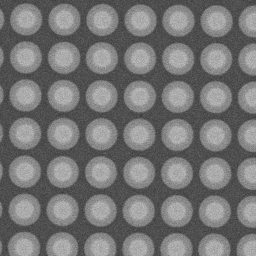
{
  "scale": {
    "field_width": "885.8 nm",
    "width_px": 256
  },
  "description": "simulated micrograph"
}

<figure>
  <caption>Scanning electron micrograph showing an array of small figures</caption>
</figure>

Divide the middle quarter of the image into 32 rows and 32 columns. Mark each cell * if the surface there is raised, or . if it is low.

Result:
***...*******...*******..*******
***....*****....******....*****.
...........................***..
................................
**......***.......**.......***..
***...******....******....*****.
****..*******..*******...*******
****..*******..********..*******
****..*******..********..*******
****..*******..********..*******
***...*******...******...*******
**.....****......****.....*****.
................................
................................
**.....*****....*****.....*****.
***...*******...******...*******
****.********..********..*******
****.********..********.********
****.********..********.********
***...*******..*******...*******
**.....*****....******...******.
...........................***..
................................
*.......***......***.......**...
***...******....******...******.
***...*******..*******...*******
****.********..********.********
****.********..********.********
***..********..********..*******
***...******....******...******.
*......****......****.....*****.
................................